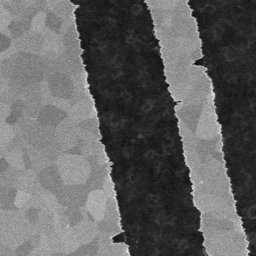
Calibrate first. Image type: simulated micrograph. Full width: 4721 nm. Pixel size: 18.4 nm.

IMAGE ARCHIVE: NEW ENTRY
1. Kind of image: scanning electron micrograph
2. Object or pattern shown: one or a few lines or trenches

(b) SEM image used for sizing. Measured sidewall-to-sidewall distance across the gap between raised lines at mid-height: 1410 nm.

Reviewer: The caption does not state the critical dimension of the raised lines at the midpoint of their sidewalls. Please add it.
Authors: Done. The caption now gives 737 nanometers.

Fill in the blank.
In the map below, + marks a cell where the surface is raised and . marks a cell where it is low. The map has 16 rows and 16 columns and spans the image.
+++++....+++....
+++++.....++....
+++++.....+++...
+++++.....++....
+++++.....+++...
+++++......++...
++++++.....++...
++++++.....+++..
++++++.....+++..
+++++++....+++..
+++++++.....++..
+++++++.....++..
+++++++.....+++.
+++++++......++.
+++++++......++.
++++++++.....+++